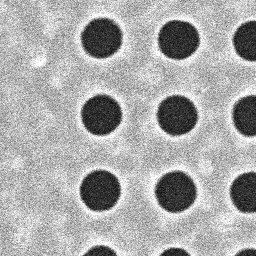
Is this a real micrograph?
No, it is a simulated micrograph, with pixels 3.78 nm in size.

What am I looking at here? holes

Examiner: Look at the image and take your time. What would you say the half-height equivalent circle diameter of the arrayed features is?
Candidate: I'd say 0.154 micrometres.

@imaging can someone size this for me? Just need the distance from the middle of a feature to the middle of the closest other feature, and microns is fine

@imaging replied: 0.285